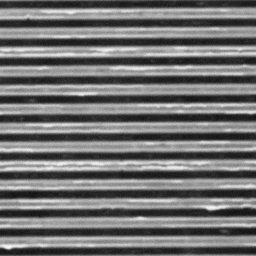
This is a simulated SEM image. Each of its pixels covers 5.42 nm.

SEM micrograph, parallel lines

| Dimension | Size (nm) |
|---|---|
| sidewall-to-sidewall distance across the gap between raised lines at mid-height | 54.2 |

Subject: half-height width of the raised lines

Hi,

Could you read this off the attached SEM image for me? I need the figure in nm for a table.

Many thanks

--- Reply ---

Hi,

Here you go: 49.5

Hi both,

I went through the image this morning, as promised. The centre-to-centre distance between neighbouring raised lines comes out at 0.103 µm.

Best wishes